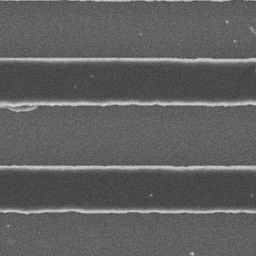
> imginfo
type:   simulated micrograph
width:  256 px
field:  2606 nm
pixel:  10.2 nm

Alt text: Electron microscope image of lines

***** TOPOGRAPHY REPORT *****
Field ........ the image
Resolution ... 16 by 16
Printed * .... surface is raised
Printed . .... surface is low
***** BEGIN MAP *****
................
................
................
................
****************
****************
****************
................
................
................
****************
****************
****************
................
................
................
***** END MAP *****